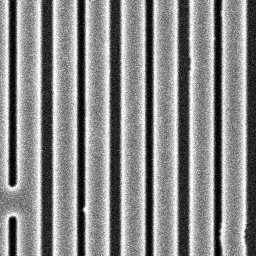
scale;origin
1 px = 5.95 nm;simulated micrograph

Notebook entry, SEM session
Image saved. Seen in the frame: parallel lines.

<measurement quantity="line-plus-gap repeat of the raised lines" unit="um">0.203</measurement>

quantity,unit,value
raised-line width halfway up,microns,0.141